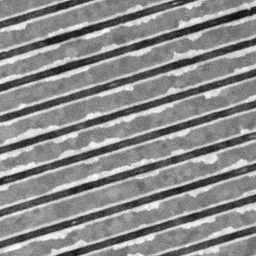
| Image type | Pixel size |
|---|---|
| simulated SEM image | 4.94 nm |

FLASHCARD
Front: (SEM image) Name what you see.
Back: parallel lines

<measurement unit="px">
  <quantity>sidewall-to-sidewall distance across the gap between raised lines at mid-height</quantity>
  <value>9.92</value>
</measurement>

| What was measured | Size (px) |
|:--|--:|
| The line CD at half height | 19.8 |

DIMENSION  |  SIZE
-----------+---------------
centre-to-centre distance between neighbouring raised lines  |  0.148 micrometres